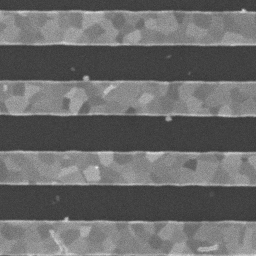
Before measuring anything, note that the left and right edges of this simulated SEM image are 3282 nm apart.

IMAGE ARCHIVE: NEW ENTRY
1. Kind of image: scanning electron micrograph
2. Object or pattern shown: wiring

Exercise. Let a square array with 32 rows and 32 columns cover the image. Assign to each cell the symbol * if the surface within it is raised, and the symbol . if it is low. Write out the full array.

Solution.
................................
*****.*****.****..*.***.........
********************************
********************************
********************************
*******.************************
................................
................................
................................
................................
********************************
********************************
********************************
********************************
...........................*****
................................
................................
................................
................................
********************************
********************************
********************************
********************************
................................
................................
................................
................................
................................
********************************
********************************
********************************
********************************